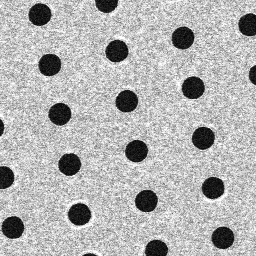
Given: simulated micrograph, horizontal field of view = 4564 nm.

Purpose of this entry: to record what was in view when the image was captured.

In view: a regular array of holes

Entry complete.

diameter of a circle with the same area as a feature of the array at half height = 413 nanometres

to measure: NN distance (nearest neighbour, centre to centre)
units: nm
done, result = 906